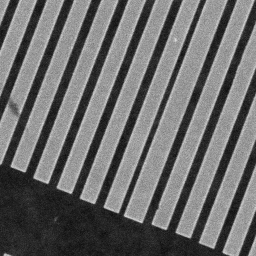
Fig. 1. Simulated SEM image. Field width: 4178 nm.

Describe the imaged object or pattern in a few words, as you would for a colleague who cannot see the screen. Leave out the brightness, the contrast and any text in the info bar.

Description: parallel lines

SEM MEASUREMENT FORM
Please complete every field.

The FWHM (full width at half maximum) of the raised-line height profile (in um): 0.261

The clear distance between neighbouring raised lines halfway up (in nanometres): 150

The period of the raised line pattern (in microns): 0.413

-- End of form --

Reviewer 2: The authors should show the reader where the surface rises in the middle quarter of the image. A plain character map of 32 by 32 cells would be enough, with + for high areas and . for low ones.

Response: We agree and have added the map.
...++++...++++...++++..+++++.+++
...++++...++++..++++...++++..+++
..++++...++++...++++...++++..+++
..++++...++++...++++..++++..++++
..++++..++++...++++...++++..++++
.++++...++++...++++...++++..++++
.++++...++++..+++++..++++..+++++
+++++..++++...++++...++++..+++++
++++...++++...++++..+++++.+++++.
++++..+++++..++++...++++..+++++.
+++...++++...++++...++++..+++++.
+++...++++..+++++..++++..+++++..
+++..++++...++++...++++..+++++..
++...++++...++++..+++++.++++++..
++...++++..++++...++++..+++++...
++..++++...++++...++++..+++++..+
+...++++...++++..++++..+++++...+
+..+++++..++++...++++..+++++...+
...++++...++++...++++..+++++..++
...++++..+++++..++++..+++++...++
..++++...++++...++++..+++++..+++
..++++...++++..+++++.+++++...+++
.+++++..++++...++++..+++++...+++
.++++...++++...++++..+++++..++++
.++++..+++++..++++..+++++...++++
++++...++++...++++..+++++...++++
++++...++++...++++.++++++..++++.
++++..++++...++++..+++++...++++.
+++...++++...++++..+++++..+++++.
+++...++++..++++..+++++...++++..
+++..++++...++++..+++++...++++..
++...++++...++++..+++++..++++...